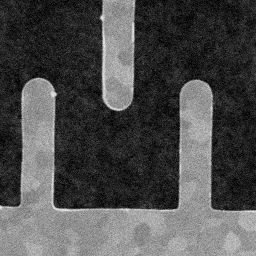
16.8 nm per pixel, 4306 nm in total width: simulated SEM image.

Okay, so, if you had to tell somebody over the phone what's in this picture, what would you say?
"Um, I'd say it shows groups of lines, slits or small figures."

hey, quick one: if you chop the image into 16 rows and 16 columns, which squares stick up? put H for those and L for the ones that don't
LLLLLLHHLLLLLLLL
LLLLLLHHLLLLLLLL
LLLLLLHHLLLLLLLL
LLLLLLHHLLLLLLLL
LLLLLLHHLLLLLLLL
LLHLLLHHLLLHHLLL
LHHLLLLHLLLHHLLL
LHHLLLLLLLLHHLLL
LHHLLLLLLLLHHLLL
LHHLLLLLLLLHHLLL
LHHLLLLLLLLHHLLL
LHHLLLLLLLLHHLLL
LHHLLLLLLLLHHLLL
HHHHHHHHHHHHHHHH
HHHHHHHHHHHHHHHH
HHHHHHHHHHHHHHHH